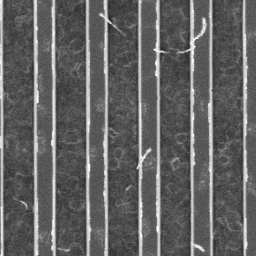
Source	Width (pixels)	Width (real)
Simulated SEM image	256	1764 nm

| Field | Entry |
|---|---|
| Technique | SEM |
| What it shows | parallel lines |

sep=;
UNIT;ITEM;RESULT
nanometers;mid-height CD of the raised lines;136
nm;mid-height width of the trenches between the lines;223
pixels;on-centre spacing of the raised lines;52.2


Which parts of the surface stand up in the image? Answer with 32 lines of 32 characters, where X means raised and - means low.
----XXX----XX----XXX----XX-----X
----XXX----XX----XXX----XX-----X
----XXX----XX----XXX----XX-----X
----XXX----XX----XXX----XX-----X
----XXX----XX----XXX----XX----XX
----XXX----XX----XXX----XX-----X
----XXX----XX----XXX----XX-----X
----XXX----XX----XXX----XX-----X
----XXX----XX----XXX----XX-----X
----XXX----XX----XXX----XX-----X
----XXX----XX----XXX----XX-----X
----XXX----XX----XXX----XX-----X
----XXX----XX----XXX----XX-----X
----XXX----XX----XXX----XX-----X
----XXX----XX----XXX----XX-----X
----XXX----XX----XXX----XX-----X
----XXX----XX----XXX----XX-----X
----XXX----XX-----XX----XX-----X
----XXX----XX----XXX----XX-----X
----XXX----XX----XXX----XX-----X
----XXX----XX----XXX----XX-----X
----XXX----XX----XXX----XX-----X
----XXX----XX----XXX----XX-----X
----XXX----XX----XXX----XX-----X
----XXX----XX----XXX----XX-----X
----XXX----XX----XXX----XX-----X
----XXX----XX----XXX----XX-----X
----XXX----XX----XXX----XX-----X
----XXX----XX----XXX----XX-----X
----XXX----XX----XXX----XX-----X
----XXX----XX-----XX----XX-----X
----XXX----XX-----XX----XX-----X